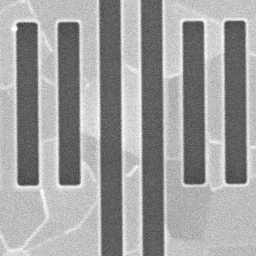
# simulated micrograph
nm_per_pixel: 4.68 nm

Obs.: groups of lines, slits or small figures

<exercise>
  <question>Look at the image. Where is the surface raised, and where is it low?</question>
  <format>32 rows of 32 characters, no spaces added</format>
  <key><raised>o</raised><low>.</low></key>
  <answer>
oooooooooooo...oo...oooooooooooo
oooooooooooo...oo...oooooooooooo
oooooooooooo...oo...ooo..oooo.oo
oo...oo...oo...oo...ooo...oo...o
oo...oo...oo...oo...ooo...oo...o
oo...oo...oo...oo...ooo...oo...o
oo...oo...oo...oo...ooo...oo...o
oo...oo...oo...oo...ooo...oo...o
oo...oo...oo...oo...ooo...oo...o
oo...oo...oo...oo...ooo...oo...o
oo...oo...oo...oo...ooo...oo...o
oo...oo...oo...oo...ooo...oo...o
oo...oo...oo...oo...ooo...oo...o
oo...oo...oo...oo....oo...oo...o
oo...oo...oo...ooo...oo...oo...o
oo...oo...oo...ooo...oo...oo...o
oo...oo...oo...ooo...oo...oo...o
oo...oo...oo...ooo...oo...oo...o
oo...oo...oo...ooo...oo...oo...o
oo...oo...oo...ooo...oo...oo...o
oo...oo...oo...ooo...oo...oo...o
oo...oo...oo...ooo...oo...oo...o
oo...oo...oo...ooo...oo...oo...o
oooooooooooo...ooo...ooooooooooo
oooooooooooo...ooo...ooooooooooo
oooooooooooo...ooo...ooooooooooo
ooooooooooooo..ooo...ooooooooooo
ooooooooooooo..ooo...ooooooooooo
ooooooooooooo..ooo...ooooooooooo
ooooooooooooo..ooo...ooooooooooo
ooooooooooooo..ooo...ooooooooooo
ooooooooooooo..ooo...ooooooooooo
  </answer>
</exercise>